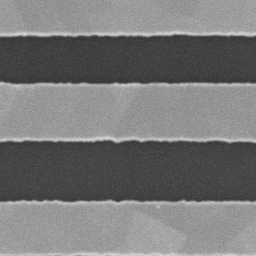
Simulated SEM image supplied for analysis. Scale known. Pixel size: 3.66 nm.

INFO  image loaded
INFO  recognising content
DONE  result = lines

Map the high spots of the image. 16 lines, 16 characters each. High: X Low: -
XXXXXXXXXXXXXXXX
XXXXXXXXXXXXXXXX
----------------
----------------
----------------
XXXXXXXXXXXXXXXX
XXXXXXXXXXXXXXXX
XXXXXXXXXXXXXXXX
XXXXXXXXXXXXXXXX
----------------
----------------
----------------
----------------
XXXXXXXXXXXXXXXX
XXXXXXXXXXXXXXXX
XXXXXXXXXXXXXXXX